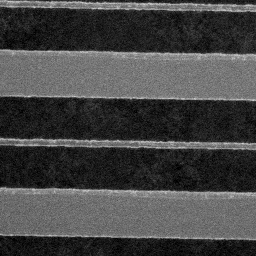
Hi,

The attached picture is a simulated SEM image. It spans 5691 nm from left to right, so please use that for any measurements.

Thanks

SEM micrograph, lines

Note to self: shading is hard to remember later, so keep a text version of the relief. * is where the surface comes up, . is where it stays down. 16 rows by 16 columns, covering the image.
................
................
................
****************
****************
****************
................
................
................
................
................
................
****************
****************
****************
................